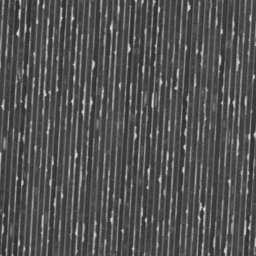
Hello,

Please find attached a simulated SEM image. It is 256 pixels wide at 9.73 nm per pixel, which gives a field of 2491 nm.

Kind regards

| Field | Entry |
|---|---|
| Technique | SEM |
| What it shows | parallel lines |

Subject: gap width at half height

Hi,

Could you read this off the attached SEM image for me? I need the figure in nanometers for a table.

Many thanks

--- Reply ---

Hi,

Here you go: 46.1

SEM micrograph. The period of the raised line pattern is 112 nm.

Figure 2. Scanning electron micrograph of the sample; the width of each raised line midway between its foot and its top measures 0.0644 µm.